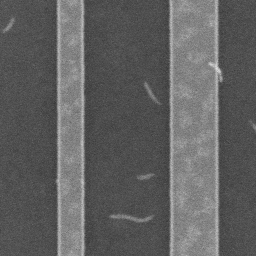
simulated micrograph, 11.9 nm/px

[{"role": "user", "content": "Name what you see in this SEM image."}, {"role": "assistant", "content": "one or a few lines or trenches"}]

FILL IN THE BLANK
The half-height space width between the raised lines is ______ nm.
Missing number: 1050